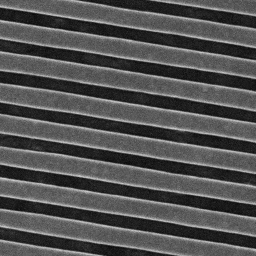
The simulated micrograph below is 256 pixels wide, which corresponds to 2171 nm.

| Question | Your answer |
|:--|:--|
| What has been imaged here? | parallel lines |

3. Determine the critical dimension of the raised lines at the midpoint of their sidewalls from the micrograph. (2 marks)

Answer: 0.158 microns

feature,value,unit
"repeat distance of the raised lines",0.263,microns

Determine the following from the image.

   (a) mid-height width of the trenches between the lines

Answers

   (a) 104 nm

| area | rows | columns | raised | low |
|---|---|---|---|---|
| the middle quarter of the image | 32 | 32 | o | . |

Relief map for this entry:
ooooooo....................ooooo
ooooooooooooo...................
oooooooooooooooooooo............
oooooooooooooooooooooooooo......
...ooooooooooooooooooooooooooooo
..........oooooooooooooooooooooo
................oooooooooooooooo
oo....................oooooooooo
oooooooo.....................ooo
ooooooooooooo...................
oooooooooooooooooooo............
oooooooooooooooooooooooooo......
...ooooooooooooooooooooooooooooo
..........oooooooooooooooooooooo
................oooooooooooooooo
oo....................oooooooooo
oooooooo......................oo
oooooooooooooo..................
ooooooooooooooooooooo...........
ooooooooooooooooooooooooooo.....
.....ooooooooooooooooooooooooooo
...........ooooooooooooooooooooo
.................ooooooooooooooo
oooo...................ooooooooo
ooooooooooo...................oo
ooooooooooooooooo...............
oooooooooooooooooooooo..........
oooooooooooooooooooooooooooo....
.....ooooooooooooooooooooooooooo
............oooooooooooooooooooo
..................oooooooooooooo
oooo....................oooooooo